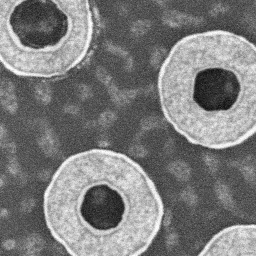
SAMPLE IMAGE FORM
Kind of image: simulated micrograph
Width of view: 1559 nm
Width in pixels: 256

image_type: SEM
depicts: ring-shaped raised bodies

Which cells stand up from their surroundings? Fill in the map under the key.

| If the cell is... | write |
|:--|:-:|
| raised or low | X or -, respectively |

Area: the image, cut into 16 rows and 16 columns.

X---XX----------
X---XX----------
X---XX------XXX-
XXXXX------XXXXX
-XXX------XXX--X
----------XX---X
----------XX---X
-----------XXXXX
------------XXX-
------X---------
----XXXXX-------
---XXXXXX-------
---XX---XX------
---XX---XX------
---XXXXXXX----XX
----XXXXX----XXX